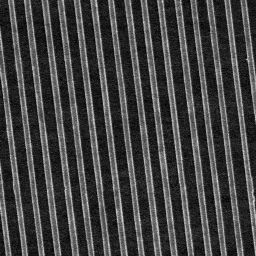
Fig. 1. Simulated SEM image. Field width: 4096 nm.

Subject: parallel lines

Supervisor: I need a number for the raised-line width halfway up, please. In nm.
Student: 73.5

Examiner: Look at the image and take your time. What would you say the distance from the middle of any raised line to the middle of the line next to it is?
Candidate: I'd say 264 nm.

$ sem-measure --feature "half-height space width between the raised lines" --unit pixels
11.9